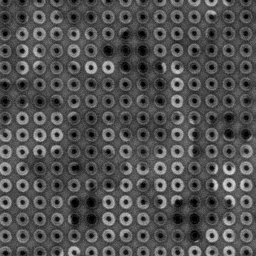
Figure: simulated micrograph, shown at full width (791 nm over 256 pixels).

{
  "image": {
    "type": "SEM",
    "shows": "a regular array of ring-shaped raised bodies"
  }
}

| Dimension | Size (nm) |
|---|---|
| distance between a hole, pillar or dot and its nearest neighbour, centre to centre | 51.6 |